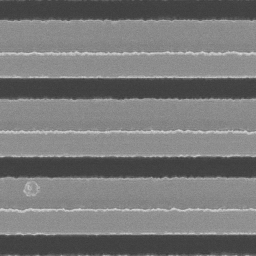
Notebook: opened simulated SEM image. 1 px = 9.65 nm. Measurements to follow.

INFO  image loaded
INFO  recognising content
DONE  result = lines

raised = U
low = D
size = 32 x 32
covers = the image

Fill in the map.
DDDDDDDDDDDDDDDDDDDDDDDDDDDDDDDD
DDDDDDDDDDDDDDDDDDDDDDDDDDDDDDDD
DDDUUDUDDDUUDUDDUUDDUUUUDDUUUDUD
UUUUUUUUUUUUUUUUUUUUUUUUUUUUUUUU
UUUUUUUUUUUUUUUUUUUUUUUUUUUUUUUU
UUUUUUUUUUUUUUUUUUUUUUUUUUUUUUUU
UUUUUUUUUUUUUUUUUUUUUUUUUUUUUUUU
UUUUUUUUUUUUUUUUUUUUUUUUUUUUUUUU
UUUUUUUUUUUUUUUUUUUUUUUUUUUUUUUU
UUUUUUUUUUUUUUUUUUUUUUUUUUUUUUUU
DDDDDDDDDDDDDDDDDDDDDDDDDDDDDDDD
DDDDDDDDDDDDDDDDDDDDDDDDDDDDDDDD
DDUUUUUUUDUUUUDUUUUUUUUUUUUUUDUU
UUUUUUUUUUUUUUUUUUUUUUUUUUUUUUUU
UUUUUUUUUUUUUUUUUUUUUUUUUUUUUUUU
UUUUUUUUUUUUUUUUUUUUUUUUUUUUUUUU
UUUUUUUUUUUUUUUUUUUUUUUUUUUUUUUU
UUUUUUUUUUUUUUUUUUUUUUUUUUUUUUUU
UUUUUUUUUUUUUUUUUUUUUUUUUUUUUUUU
UUUUUUUUUUUUUUUUUDUUUUUUUDDUUDUU
DDDDDDDDDDDDDDDDDDDDDDDDDDDDDDDD
DDDDDDDDDDDDDDDDDDDDDDDDDDDDDDDD
UUUUUUUUUUUUUUUUUUUUUUUUUUUUUUUU
UUUUUUUUUUUUUUUUUUUUUUUUUUUUUUUU
UUUUUUUUUUUUUUUUUUUUUUUUUUUUUUUU
UUUUUUUUUUUUUUUUUUUUUUUUUUUUUUUU
UUUUUUUUUUUUUUUUUUUUUUUUUUUUUUUU
UUUUUUUUUUUUUUUUUUUUUUUUUUUUUUUU
UUUUUUUUUUUUUUUUUUUUUUUUUUUUUUUU
DDDDDDDDDDDDDDDDDDDDDDDDDDDDDDDD
DDDDDDDDDDDDDDDDDDDDDDDDDDDDDDDD
DDDDDDDDDDDDDDDDDDDDDDDDDDDDDDDD